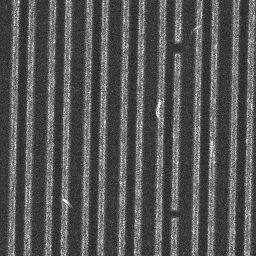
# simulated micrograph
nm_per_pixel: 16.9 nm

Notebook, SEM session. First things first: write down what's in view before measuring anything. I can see parallel lines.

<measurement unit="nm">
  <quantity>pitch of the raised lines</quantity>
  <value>305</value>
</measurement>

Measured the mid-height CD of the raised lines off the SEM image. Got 114 nm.